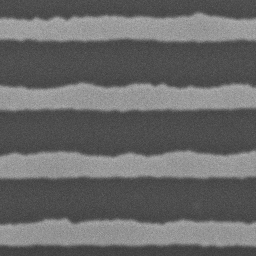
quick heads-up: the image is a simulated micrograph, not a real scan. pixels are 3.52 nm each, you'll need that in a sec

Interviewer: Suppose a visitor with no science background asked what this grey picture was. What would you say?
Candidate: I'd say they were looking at lines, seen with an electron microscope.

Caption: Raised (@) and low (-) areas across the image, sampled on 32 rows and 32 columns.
--------------------------------
--------------------------------
@@--@-@@-@@@@@@@@@@@@@@@@@@@@--@
@@@@@@@@@@@@@@@@@@@@@@@@@@@@@@@@
@@@@@@@@@@@@@@@@@@@@@@@@@@@@@@@@
--------------------------------
--------------------------------
--------------------------------
--------------------------------
--------------------------------
----------@---------------------
@@@@@@@@@@@@@@@@@@@@@@@@@@@@@@@@
@@@@@@@@@@@@@@@@@@@@@@@@@@@@@@@@
@@@@@@@@@@@@@@@@@@@@@@@@@@@@@@--
--------------------------------
--------------------------------
--------------------------------
--------------------------------
--------------------------------
@@@@@@@@@@@@---@@@-@@@@@@@@@@@@@
@@@@@@@@@@@@@@@@@@@@@@@@@@@@@@@@
@@@@@@@@@@@@@@@@@@@@@@@@@@@@@@@@
--------------------------------
--------------------------------
--------------------------------
--------------------------------
--------------------------------
------@@------------------------
@@@@@@@@@@@@@@@@@@@@@@@@@@@@@@@@
@@@@@@@@@@@@@@@@@@@@@@@@@@@@@@@@
@@@@@@@@@@@@@@@@@@@@@@@@@@@@@@@@
--------------------------------